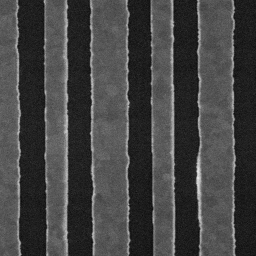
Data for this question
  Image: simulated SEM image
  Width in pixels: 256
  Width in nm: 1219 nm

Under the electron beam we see lines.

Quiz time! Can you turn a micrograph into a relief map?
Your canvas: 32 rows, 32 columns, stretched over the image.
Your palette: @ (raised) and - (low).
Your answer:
@@----@@---@@@@@---@@@---@@@@---
@@----@@---@@@@@---@@@---@@@@---
@@----@@---@@@@@---@@@---@@@@---
@@----@@---@@@@@---@@@---@@@@---
@@----@@---@@@@@---@@@---@@@@---
@@----@@---@@@@@---@@@---@@@@---
@@----@@---@@@@@---@@@---@@@@---
@@----@@---@@@@@---@@@---@@@@---
@@----@@---@@@@@---@@@---@@@@---
@@----@@---@@@@@---@@@---@@@@---
@@----@@---@@@@@---@@@---@@@@---
@@----@@---@@@@@---@@@---@@@@---
@@----@@---@@@@@---@@@---@@@@---
@@@---@@---@@@@@---@@@---@@@@---
@@@---@@---@@@@@---@@@---@@@@---
@@----@@---@@@@@---@@@---@@@@---
@@----@@---@@@@@---@@@---@@@@---
@@----@@---@@@@@---@@@---@@@@---
@@@---@@---@@@@@---@@@---@@@@---
@@----@@----@@@@---@@@---@@@@---
@@----@@----@@@@---@@@---@@@@---
@@----@@----@@@@---@@@---@@@@---
@@----@@----@@@@---@@@---@@@@---
@@----@@----@@@@---@@@---@@@@---
@@----@@----@@@@---@@@---@@@@---
@@----@@----@@@@---@@@---@@@@---
@@----@@----@@@@---@@@---@@@@---
@@----@@----@@@@---@@@---@@@@---
@@----@@----@@@@---@@@---@@@@---
@@----@@----@@@@---@@@---@@@@---
@@@---@@----@@@@---@@@---@@@@---
@@@---@@----@@@@---@@@---@@@@---